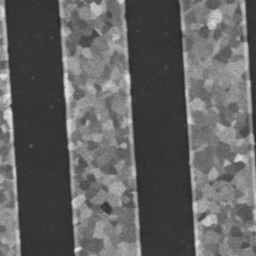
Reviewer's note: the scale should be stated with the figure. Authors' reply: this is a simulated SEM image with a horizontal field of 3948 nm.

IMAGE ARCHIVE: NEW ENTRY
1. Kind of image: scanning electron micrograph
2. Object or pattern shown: one or a few lines or trenches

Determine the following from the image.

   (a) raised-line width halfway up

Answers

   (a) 939 nm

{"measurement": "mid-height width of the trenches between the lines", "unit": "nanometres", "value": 896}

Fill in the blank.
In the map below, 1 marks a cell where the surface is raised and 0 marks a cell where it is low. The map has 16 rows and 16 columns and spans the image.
0000111100011110
0000111100011110
0000111100011110
0000111100001110
0000111100001110
0000111100001110
1000111100001111
1000111100001111
1000111100001111
1000111100001111
1000111100001111
1000011100001111
1000011100001111
1000011110001111
1000011110001111
1000011110001111